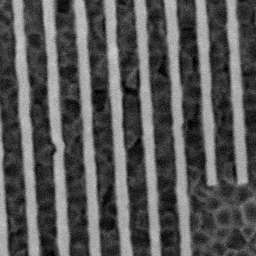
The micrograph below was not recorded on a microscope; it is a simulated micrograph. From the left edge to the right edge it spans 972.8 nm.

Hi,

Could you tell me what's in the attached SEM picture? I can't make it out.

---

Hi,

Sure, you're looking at parallel lines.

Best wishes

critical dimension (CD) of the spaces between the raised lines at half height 75.5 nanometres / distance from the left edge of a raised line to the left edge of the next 0.116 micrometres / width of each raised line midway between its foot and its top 39.9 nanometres